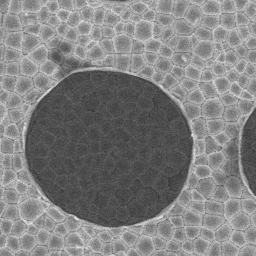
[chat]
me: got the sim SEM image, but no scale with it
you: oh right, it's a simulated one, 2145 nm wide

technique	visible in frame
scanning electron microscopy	holes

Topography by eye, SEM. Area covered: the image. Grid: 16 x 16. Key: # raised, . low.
################
################
################
################
#####..#########
###.......######
##.........#####
##..........###.
##..........###.
##..........###.
##..........###.
##..........###.
###........#####
#####.....######
################
################